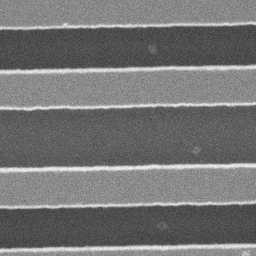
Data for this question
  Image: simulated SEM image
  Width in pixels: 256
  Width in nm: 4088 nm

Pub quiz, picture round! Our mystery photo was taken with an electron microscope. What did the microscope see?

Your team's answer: lines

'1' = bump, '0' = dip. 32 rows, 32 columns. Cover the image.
11111111111111111111111111111111
11111111111111111111111111111111
11111111111111111111111111111111
11111100000000000000000000000000
00000000000000000000000000000000
00000000000000000000000000000000
00000000000000000000000000000000
00000000000000000000000000000000
00000000000000001111111111111111
11111111111111111111111111111111
11111111111111111111111111111111
11111111111111111111111111111111
11111111111111111111111111111111
11111111111111000000000000000000
00000000000000000000000000000000
00000000000000000000000000000000
00000000000000000000000000000000
00000000000000000000000000000000
00000000000000000000000000000000
00000000000000000000000000000000
00000000000000000000000000000000
11111111111111111111111111111111
11111111111111111111111111111111
11111111111111111111111111111111
11111111111111111111111111111111
11111111111111111111111111111000
00000000000000000000000000000000
00000000000000000000000000000000
00000000000000000000000000000000
00000000000000000000000000000000
00000000000000000000000000000000
11111111111111111111111111111111